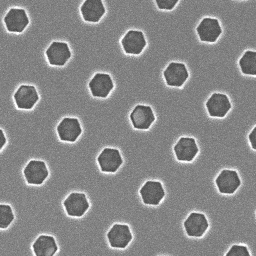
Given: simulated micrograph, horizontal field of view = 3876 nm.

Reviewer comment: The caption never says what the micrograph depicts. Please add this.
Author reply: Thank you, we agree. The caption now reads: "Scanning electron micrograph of a regular array of holes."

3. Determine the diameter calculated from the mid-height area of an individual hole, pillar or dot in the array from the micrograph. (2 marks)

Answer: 24.2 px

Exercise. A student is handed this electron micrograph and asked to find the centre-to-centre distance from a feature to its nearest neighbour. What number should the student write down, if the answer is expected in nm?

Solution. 800